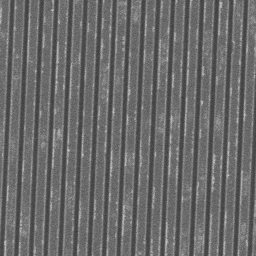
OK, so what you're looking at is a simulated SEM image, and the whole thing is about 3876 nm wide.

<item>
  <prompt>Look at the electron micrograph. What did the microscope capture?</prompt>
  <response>parallel lines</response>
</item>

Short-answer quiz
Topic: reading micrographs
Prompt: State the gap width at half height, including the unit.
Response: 71.8 nanometres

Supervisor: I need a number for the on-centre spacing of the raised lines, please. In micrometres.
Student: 0.221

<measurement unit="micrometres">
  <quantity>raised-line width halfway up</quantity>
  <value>0.146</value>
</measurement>